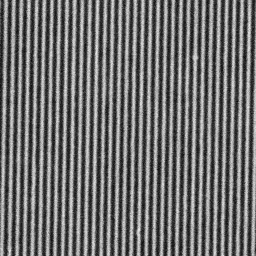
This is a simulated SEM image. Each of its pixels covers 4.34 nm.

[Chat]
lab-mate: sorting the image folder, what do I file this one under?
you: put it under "parallel lines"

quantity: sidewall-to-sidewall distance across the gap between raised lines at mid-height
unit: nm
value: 19.5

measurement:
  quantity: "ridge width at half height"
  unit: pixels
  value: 2.74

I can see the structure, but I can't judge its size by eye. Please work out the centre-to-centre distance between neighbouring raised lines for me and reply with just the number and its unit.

0.033 micrometres